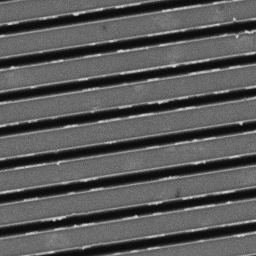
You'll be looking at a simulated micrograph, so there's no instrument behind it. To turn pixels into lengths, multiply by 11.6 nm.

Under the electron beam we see parallel lines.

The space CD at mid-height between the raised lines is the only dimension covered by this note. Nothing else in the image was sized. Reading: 0.233 microns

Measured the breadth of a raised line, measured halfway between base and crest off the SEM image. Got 154 nm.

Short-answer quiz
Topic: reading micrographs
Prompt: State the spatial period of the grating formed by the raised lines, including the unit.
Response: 385 nm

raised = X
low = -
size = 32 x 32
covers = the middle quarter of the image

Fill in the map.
--------------------------XXXXXX
-------------------XXXXXXXXXXXXX
-------------XXXXXXXXXXXXXXXXXXX
------XXXXXXXXXXXXXXXXXXXX------
XXXXXXXXXXXXXXXXXXX-------------
XXXXXXXXXXXXX-------------------
XXXXXX--------------------------
--------------------------------
-----------------------------XXX
----------------------XXXXXXXXXX
--------------XXXXXXXXXXXXXXXXXX
--------XXXXXXXXXXXXXXXXXXXXX---
-XXXXXXXXXXXXXXXXXXXXXX---------
XXXXXXXXXXXXXXXX----------------
XXXXXXXXXX----------------------
XXX-----------------------------
------------------------------XX
------------------------XXXXXXXX
------------------XXXXXXXXXXXXXX
-----------XXXXXXXXXXXXXXXXXXXXX
-----XXXXXXXXXXXXXXXXXXXXX------
XXXXXXXXXXXXXXXXXXX-------------
XXXXXXXXXXXXX-------------------
XXXXXX--------------------------
--------------------------------
---------------------------XXXXX
---------------------XXXXXXXXXXX
--------------XXXXXXXXXXXXXXXXXX
--------XXXXXXXXXXXXXXXXXXXXX---
-XXXXXXXXXXXXXXXXXXXXX----------
XXXXXXXXXXXXXXXX----------------
XXXXXXXXX-----------------------